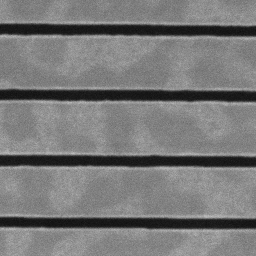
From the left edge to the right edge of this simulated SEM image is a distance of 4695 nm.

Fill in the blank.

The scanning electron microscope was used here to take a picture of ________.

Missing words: lines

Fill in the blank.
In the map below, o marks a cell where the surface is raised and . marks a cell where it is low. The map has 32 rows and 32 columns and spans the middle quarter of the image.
oooooooooooooooooooooooooooooooo
oooooooooooooooooooooooooooooooo
oooooooooooooooooooooooooooooooo
oooooooooooooooooooooooooooooooo
oooooooooooooooooooooooooooooooo
oooooooooooooooooooooooooooooooo
................................
................................
................................
ooooooooooooooooooooooooooooooo.
oooooooooooooooooooooooooooooooo
oooooooooooooooooooooooooooooooo
oooooooooooooooooooooooooooooooo
oooooooooooooooooooooooooooooooo
oooooooooooooooooooooooooooooooo
oooooooooooooooooooooooooooooooo
oooooooooooooooooooooooooooooooo
oooooooooooooooooooooooooooooooo
oooooooooooooooooooooooooooooooo
oooooooooooooooooooooooooooooooo
oooooooooooooooooooooooooooooooo
oooooooooooooooooooooooooooooooo
oooooooooooooooooooooooooooooooo
................................
................................
................................
oooooooooooooooooooooooooooooooo
oooooooooooooooooooooooooooooooo
oooooooooooooooooooooooooooooooo
oooooooooooooooooooooooooooooooo
oooooooooooooooooooooooooooooooo
oooooooooooooooooooooooooooooooo